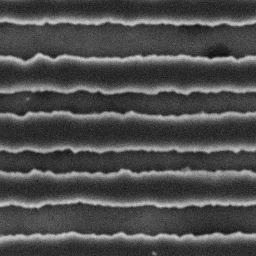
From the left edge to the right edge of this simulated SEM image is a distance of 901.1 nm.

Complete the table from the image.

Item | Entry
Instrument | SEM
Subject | lines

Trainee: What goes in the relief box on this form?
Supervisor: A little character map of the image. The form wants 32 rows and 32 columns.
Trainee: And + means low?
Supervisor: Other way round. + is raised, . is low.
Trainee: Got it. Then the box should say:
++++++++++++++++++++++++++++++++
++++++++++++++++++++++++++++++++
++++++++++++++++++++++++++++++++
................................
................................
................................
................................
+++.++++++++++++++++++++++++++++
++++++++++++++++++++++++++++++++
++++++++++++++++++++++++++++++++
++++++++++++++++++++++++++++++++
++......+...++++..++..++......+.
................................
................................
++.++++++++++++++++....+++++++++
++++++++++++++++++++++++++++++++
++++++++++++++++++++++++++++++++
++++++++++++++++++++++++++++++++
++++++++++++++++++++++++++++++++
................................
................................
....++.........++..++++++...+++.
++++++++++++++++++++++++++++++++
++++++++++++++++++++++++++++++++
++++++++++++++++++++++++++++++++
+++++++......+++++++++++++++++++
................................
................................
................................
..+.+++++++++++++++.++.+.+++++++
++++++++++++++++++++++++++++++++
++++++++++++++++++++++++++++++++